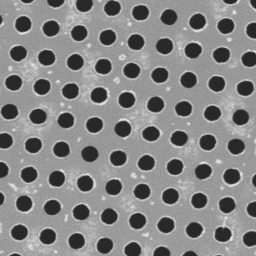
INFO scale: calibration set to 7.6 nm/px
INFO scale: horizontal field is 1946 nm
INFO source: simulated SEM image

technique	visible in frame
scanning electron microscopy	a regular array of holes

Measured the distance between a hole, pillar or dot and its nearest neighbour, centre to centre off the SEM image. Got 218 nm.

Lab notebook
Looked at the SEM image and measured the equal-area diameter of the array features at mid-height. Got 126 nanometres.